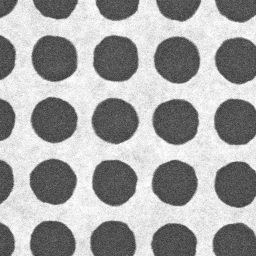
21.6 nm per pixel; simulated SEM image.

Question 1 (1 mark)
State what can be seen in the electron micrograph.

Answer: a regular array of holes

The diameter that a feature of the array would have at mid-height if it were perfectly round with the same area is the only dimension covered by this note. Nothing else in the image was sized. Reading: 0.998 micrometres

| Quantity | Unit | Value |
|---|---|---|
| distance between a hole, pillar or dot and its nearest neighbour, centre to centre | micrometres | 1.32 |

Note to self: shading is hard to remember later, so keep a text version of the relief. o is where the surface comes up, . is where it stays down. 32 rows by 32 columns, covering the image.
..oo......oo.....ooo.....oo.....
.oooo....oooo....ooo....ooo.....
oooooooooooooo.ooooooo.oooooo..o
oooooooooooooooooooooooooooooooo
oooooo.ooooooo.ooooooooooooooooo
.ooo.....ooo.....ooo....oooo....
..oo.....ooo.....oo......oo.....
..oo......oo.....oo......oo.....
..oo......oo.....oo......oo.....
.oooo....oooo....ooo....oooo....
ooooooooooooooooooooooooooooo.oo
oooooooooooooooooooooooooooooooo
ooooo...ooooo..oooooo..ooooo..oo
..oo.....ooo.....ooo....ooo.....
..oo......oo.....oo......oo.....
..oo......oo.....oo......oo.....
..oo.....ooo.....oo......oo.....
.oooo...ooooo...oooo....oooo...o
oooooooooooooooooooooooooooooooo
oooooooooooooooooooooooooooooooo
.oooo...oooo....oooo...oooooo..o
..oo.....ooo.....oo.....ooo.....
..oo......o......oo......oo.....
..oo.....ooo.....oo......oo.....
.ooo.....ooo.....ooo....ooo.....
oooooo..ooooo..oooooo..ooooo...o
oooooooooooooooooooooooooooooooo
oooooooooooooooooooooooooooooooo
.ooo.....ooo....oooo...ooooo...o
..oo.....oo......oo.....ooo.....
..oo.....oo......oo......oo.....
..oo.....ooo.....oo......oo.....